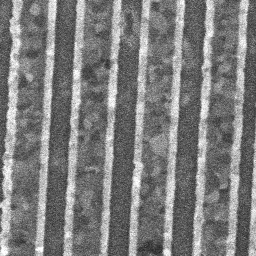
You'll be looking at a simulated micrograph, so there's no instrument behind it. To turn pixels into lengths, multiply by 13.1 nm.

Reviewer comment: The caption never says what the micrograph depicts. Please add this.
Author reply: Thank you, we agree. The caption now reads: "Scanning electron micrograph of one or a few lines or trenches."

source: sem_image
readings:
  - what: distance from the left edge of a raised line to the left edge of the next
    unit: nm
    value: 840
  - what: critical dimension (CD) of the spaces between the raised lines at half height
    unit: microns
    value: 0.361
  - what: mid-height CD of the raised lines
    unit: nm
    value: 466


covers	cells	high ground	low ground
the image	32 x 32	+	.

..+++++...+++++...+++++...+++++.
..+++++...+++++...+++++...++++..
..++++....+++++...++++....++++..
..++++....+++++...++++....++++..
..++++....+++++...++++....++++..
..++++....+++++...++++....++++..
..++++....++++....++++....++++..
..++++....++++....++++....++++..
..++++....++++....++++....++++..
..++++....++++....++++....++++..
..++++....++++....++++....++++..
..++++....++++....++++....++++..
..++++...+++++....++++....++++..
..++++...+++++....++++....++++..
.+++++...+++++...+++++...+++++..
.+++++...+++++...+++++...+++++..
.+++++...+++++...+++++...+++++..
.+++++...+++++...+++++...+++++..
.+++++...+++++...+++++...+++++..
.+++++...+++++...+++++...++++...
.+++++...+++++...++++....++++...
.++++....+++++...++++....++++...
.++++....++++....++++....++++...
.++++....++++....++++....++++...
.++++....++++....++++....++++...
.++++....++++....++++....++++...
.++++....++++....++++....++++...
.++++....++++....++++....++++...
.++++....++++....++++....++++...
.++++....++++....++++....++++...
+++++...+++++....++++....++++...
.++++...+++++....++++....++++...